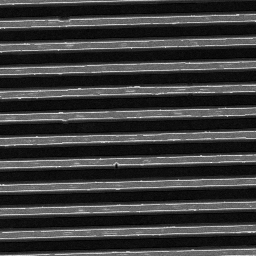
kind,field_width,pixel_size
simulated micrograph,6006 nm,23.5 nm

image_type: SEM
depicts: parallel lines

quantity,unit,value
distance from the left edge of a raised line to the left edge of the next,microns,0.55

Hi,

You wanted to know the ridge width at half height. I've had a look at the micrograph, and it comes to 226 nanometers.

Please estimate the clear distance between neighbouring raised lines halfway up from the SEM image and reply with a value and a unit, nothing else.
325 nanometers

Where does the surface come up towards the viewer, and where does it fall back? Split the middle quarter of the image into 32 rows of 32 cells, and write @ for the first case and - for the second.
@@@@@@@@@@@@@@@@@@@@@@@@@@@@@@@@
@@@@@@@@@@@@@@@@@@@@@@@@@@@@@@@@
--------------------------------
--------------------------------
--------------------------------
-------------------------@@@@@@-
@@@@@@@@@@@@@@@@@@@@@@@@@@@@@@@@
@@@@@@@@@@@@@@@@@@@@@@@@@@@@@@@-
--------------------------------
--------------------------------
--------------------------------
---------------------@@@@@@@@@@@
@@@@@@@@@@@@@@@@@@@@@@@@@@@@@@@@
@@@@@@@@@@@@@@@@@@@@@@@@@@@-----
--------------------------------
--------------------------------
--------------------------------
----------------@@@@@@@@@@@@@@@@
@@@@@@@@@@@@@@@@@@@@@@@@@@@@@@@@
@@@@@@@@@@@@@@@@@@@@@@----------
--------------------------------
--------------------------------
--------------------------------
------------@@@@@@@@@@@@@@@@@@@@
@@@@@@@@@@@@@@@@@@@@@@@@@@@@@@@@
@@@@@@@@@@@@@-@@@@--------------
--------------------------------
--------------------------------
--------------------------------
--------@@@@@@@@@@@@@@@@@@@@@@@@
@@@@@@@@@@@@@@@@@@@@@@@@@@@@@@@@
@@@@@@@@@@@@@@------------------